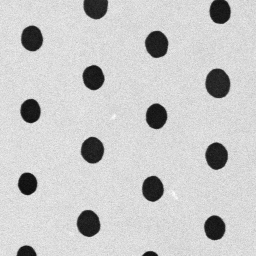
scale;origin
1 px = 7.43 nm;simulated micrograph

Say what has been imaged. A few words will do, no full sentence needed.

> a regular array of holes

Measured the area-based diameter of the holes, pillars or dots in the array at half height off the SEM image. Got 175 nm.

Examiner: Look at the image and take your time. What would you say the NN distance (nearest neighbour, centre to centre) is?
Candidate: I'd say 532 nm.